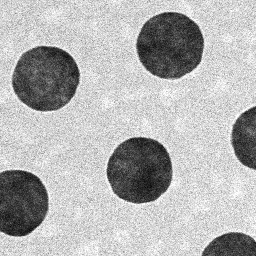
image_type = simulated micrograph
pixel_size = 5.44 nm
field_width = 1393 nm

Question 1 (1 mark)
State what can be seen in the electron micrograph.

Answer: holes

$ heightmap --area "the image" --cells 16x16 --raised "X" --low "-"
XXXXXXXXXXXXXXXX
XXXXXXXXX---XXXX
XXXXXXXXX----XXX
X---XXXXX----XXX
X----XXXX---XXXX
X----XXXXXXXXXXX
XX--XXXXXXXXXXXX
XXXXXXXXXXXXXXX-
XXXXXXXXXXXXXX--
XXXXXXX---XXXXX-
XXXXXXX----XXXXX
---XXXX----XXXXX
---XXXXX--XXXXXX
---XXXXXXXXXXXXX
--XXXXXXXXXXXXXX
XXXXXXXXXXXXX---